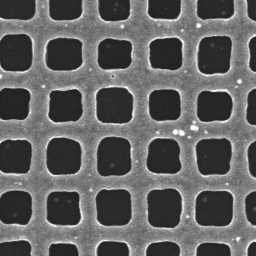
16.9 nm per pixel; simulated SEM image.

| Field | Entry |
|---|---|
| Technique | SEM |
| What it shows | a regular array of holes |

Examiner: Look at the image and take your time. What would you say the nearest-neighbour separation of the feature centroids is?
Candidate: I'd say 838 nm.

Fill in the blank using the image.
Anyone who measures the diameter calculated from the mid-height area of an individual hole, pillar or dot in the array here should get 0.639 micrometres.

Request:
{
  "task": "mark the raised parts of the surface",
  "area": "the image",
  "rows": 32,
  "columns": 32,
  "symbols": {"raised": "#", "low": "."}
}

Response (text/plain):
....##....##....##.....##....##.
....##....##....##.....##....##.
#######..####..##########.#####.
################################
#..########################.####
....##....##....###....##....##.
....##....##....###....##....##.
....##....##....###....##....##.
....##....###...###...###....##.
################################
################################
....##....##....###...###...###.
....##....##.....##....##....##.
....##....##.....##....##....##.
...###....##.....##...###....##.
###############################.
################################
#..###...####...###...###...####
....##....##....###...###....##.
....##....##....##....##.....##.
....##....##.....#.....##....##.
...###....##....###...###...###.
################################
################################
....##....##....##.....##....##.
....##....##....##.....#.....##.
....##....##....##.....#.....##.
....##....##....###....#.....##.
####################.###########
################################
....###..###....###...###...###.
....##....##....##....###....##.